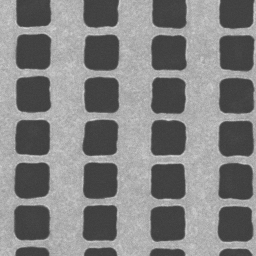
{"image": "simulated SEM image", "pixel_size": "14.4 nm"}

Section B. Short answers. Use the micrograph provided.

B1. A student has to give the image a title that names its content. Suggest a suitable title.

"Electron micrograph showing a regular array of holes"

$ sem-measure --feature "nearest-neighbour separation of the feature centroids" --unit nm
613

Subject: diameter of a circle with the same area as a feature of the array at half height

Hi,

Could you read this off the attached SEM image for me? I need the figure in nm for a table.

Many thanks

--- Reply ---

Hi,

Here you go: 556